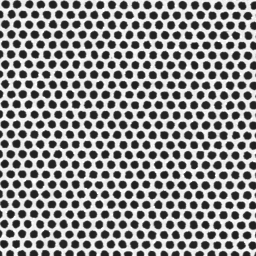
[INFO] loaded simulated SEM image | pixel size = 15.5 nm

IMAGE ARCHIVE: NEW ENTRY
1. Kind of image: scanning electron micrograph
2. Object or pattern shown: a regular array of holes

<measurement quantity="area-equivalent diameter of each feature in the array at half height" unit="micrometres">0.134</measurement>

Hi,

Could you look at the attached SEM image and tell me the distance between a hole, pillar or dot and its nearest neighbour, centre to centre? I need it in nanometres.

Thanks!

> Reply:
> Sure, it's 173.